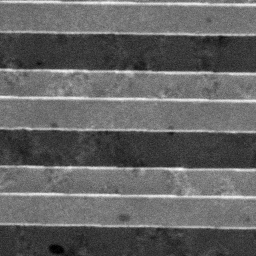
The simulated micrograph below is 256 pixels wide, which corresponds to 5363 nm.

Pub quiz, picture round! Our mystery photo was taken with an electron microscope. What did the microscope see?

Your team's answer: lines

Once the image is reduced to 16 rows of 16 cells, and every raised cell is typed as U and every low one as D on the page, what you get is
UUUUUUUUUUUUUUUU
UUUUUUUUUUUUUUUU
DDDDDDDDDDDDDDDD
DDDDDDDDDDDDDDDD
UUUUUUUUDDDDDDDD
UUUUUUUUUUUUUUUU
UUUUUUUUUUUUUUUU
UUUUUUUUUUUUUUUU
DDDDDDDDDDDDDDDD
DDDDDDDDDDDDDDDD
UUUUUUDDDDDDDDDD
UUUUUUUUUUUUUUUU
UUUUUUUUUUUUUUUU
UUUUUUUUUUUUUUUU
DDDDDDDDDDDDDDDD
DDDDDDDDDDDDDDDD